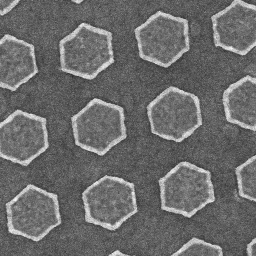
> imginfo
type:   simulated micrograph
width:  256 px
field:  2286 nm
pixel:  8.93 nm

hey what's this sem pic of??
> raised bodies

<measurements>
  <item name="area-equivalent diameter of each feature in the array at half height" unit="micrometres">0.448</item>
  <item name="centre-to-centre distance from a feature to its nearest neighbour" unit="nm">678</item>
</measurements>